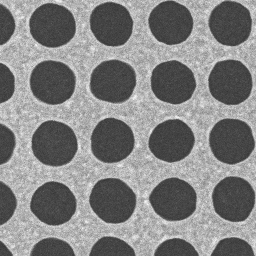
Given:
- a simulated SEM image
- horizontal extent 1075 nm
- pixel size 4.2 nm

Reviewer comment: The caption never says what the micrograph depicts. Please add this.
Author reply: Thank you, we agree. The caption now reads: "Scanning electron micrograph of a regular array of holes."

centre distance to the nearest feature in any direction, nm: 244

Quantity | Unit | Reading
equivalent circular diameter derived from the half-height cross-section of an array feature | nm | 188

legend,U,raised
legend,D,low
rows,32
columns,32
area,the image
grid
UUUUUUDUUUUUUDDUUUUUDDDUUUUDDDUU
DUUUDDDDDUUUDDDDUUUDDDDDUUDDDDDU
DDUUDDDDDUUDDDDDDUUDDDDDUUDDDDDU
DDUUDDDDDDUDDDDDDUUDDDDDUUDDDDDU
DUUUDDDDDUUUDDDDUUUDDDDDUUUDDDDU
UUUUUDDDUUUUUDDUUUUUUDUUUUUUDDUU
UUUUUUUUUUUUUUUUUUUUUUUUUUUUUUUU
UUUUUUUUUUUUUUUUUUUUUUUUUUUUDDUU
DUUUDDDDDUUUDDDDDUUDDDDDUUUDDDDU
DDUUDDDDDUUDDDDDDUUDDDDDUUDDDDDU
DDUUDDDDDUUDDDDDDUUDDDDDDUDDDDDD
DDUUDDDDDUUDDDDDDUUDDDDDUUDDDDDU
DUUUUDDDUUUUUDDDUUUUDDDUUUUDDDDU
UUUUUUUUUUUUUUUUUUUUUUUUUUUUUUUU
UUUUUUUUUUUUUUUUUUUUUUUUUUUUUUUU
UUUUUDDDUUUUDDDDUUUUDDDUUUUDDDDU
DDUUDDDDDUUUDDDDDUUDDDDDUUDDDDDD
DDUUDDDDDDUDDDDDDUUDDDDDUUDDDDDD
DDUUDDDDDDUDDDDDDUUDDDDDUUDDDDDD
DUUUDDDDDUUUDDDDUUUDDDDUUUUDDDDU
UUUUUUDDUUUUUUUUUUUUUUUUUUUUUUUU
UUUUUUUUUUUUUUUUUUUUUUUUUUUUUUUU
UUUUUUUUUUUUUDDUUUUUUDDUUUUUDDDU
DUUUUDDDDUUUDDDDUUUDDDDDUUUDDDDD
DDUUDDDDDUUDDDDDDUUDDDDDDUUDDDDD
DDUUDDDDDDUDDDDDDUUDDDDDDUUDDDDD
DDUUDDDDDUUUDDDDDUUDDDDDUUUDDDDU
DUUUUDDDDUUUUDDDUUUUUDDUUUUUDDDU
UUUUUUUUUUUUUUUUUUUUUUUUUUUUUUUU
UUUUUUUUUUUUUUUUUUUUUUUUUUUUUUUU
DUUUUDDDDUUUDDDDUUUUDDDDUUUDDDDU
DUUUDDDDDUUDDDDDDUUDDDDDDUUDDDDD